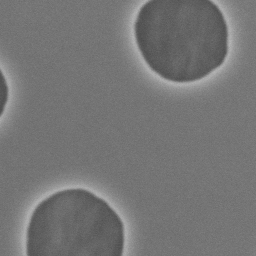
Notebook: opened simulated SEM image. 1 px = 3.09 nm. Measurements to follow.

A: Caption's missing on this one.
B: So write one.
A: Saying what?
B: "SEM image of holes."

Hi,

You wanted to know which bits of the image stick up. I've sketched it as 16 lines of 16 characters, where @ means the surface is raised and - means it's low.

@@@@@@@@@-----@@
@@@@@@@@------@@
@@@@@@@@@-----@@
@@@@@@@@@-----@@
@@@@@@@@@@---@@@
@@@@@@@@@@@@@@@@
@@@@@@@@@@@@@@@@
@@@@@@@@@@@@@@@@
@@@@@@@@@@@@@@@@
@@@@@@@@@@@@@@@@
@@@@@@@@@@@@@@@@
@@@@@@@@@@@@@@@@
@@@---@@@@@@@@@@
@@-----@@@@@@@@@
@@------@@@@@@@@
@@------@@@@@@@@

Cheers